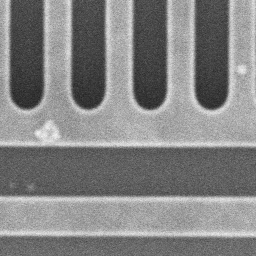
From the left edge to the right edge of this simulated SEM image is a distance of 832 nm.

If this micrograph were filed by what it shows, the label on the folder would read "groups of lines, slits or small figures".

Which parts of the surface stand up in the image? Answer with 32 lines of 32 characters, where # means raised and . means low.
#.....###....###.....###.....###
#.....###....###.....###.....###
#.....###....###.....###.....###
#.....###....###.....###.....###
#.....###....###.....###.....###
#.....###....###.....###.....###
#.....###....###.....###.....###
#.....###....###.....###.....###
#.....###....###.....###.....###
#.....###....###.....###.....###
#.....###....###.....###.....###
#.....###....####....###.....###
#....####....####....####...####
##..######..######..#####...####
################################
################################
################################
################################
................................
................................
................................
................................
................................
................................
................................
################################
################################
################################
################################
................................
................................
................................